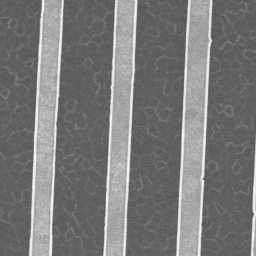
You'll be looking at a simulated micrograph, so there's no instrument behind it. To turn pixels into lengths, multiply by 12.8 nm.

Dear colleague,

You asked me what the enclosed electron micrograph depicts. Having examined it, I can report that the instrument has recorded one or a few lines or trenches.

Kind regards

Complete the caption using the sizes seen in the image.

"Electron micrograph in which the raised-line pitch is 74 px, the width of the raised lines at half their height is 258 nm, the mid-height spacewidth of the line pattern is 675 nm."